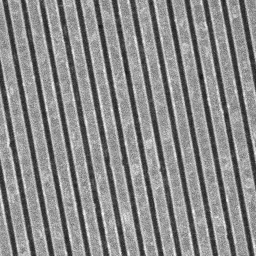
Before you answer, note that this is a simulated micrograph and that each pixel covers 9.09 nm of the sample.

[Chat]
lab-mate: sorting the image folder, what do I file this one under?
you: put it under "parallel lines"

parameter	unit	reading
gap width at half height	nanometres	54.8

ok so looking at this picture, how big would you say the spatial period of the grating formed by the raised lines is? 163 nanometres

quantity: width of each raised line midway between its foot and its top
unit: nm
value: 110